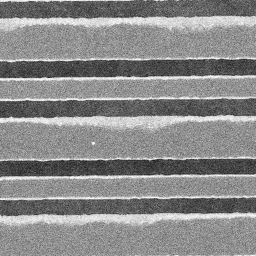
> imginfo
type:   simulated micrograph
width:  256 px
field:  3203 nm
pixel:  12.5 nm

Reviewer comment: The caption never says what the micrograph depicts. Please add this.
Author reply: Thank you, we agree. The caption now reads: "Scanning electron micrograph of lines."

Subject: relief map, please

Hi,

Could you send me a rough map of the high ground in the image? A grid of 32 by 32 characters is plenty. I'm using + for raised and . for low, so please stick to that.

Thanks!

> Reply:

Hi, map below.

................................
................................
..............++++.+......++++++
++++++++++++++++++++++++++++++++
++++++++++++++++++++++++++++++++
++++++++++++++++++++++++++++++++
++++++++++++++++++++++++++++++++
+++++++++.+.....................
................................
................................
++++++++++++++++++++++++++++++++
++++++++++++++++++++++++++++++++
+++++++.........................
................................
................................
++++++++++++++++++++++++++++++++
++++++++++++++++++++++++++++++++
++++++++++++++++++++++++++++++++
++++++++++++++++++++++++++++++++
++++++++++++++++++++++++++++++++
................................
................................
++++++++++++++++++++++++++++++++
++++++++++++++++++++++++++++++++
++++++++++++++++++++++++++++++++
................................
................................
++++++++++++++++++++++++++++++++
++++++++++++++++++++++++++++++++
++++++++++++++++++++++++++++++++
++++++++++++++++++++++++++++++++
++++++++++++++++++++++++++++++++